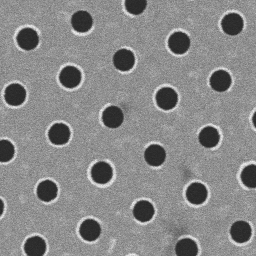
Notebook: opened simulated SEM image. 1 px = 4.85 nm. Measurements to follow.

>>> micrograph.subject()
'a regular array of holes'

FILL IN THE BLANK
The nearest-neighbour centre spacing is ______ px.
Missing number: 56.3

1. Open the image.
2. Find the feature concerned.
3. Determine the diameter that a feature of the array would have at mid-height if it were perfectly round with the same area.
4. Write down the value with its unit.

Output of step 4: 107 nanometres